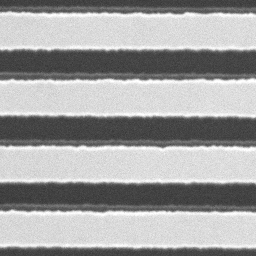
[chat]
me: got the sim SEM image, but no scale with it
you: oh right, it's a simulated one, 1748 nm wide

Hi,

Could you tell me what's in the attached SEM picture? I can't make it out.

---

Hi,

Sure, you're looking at lines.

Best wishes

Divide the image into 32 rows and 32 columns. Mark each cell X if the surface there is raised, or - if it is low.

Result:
--------------------------------
--------------------------------
XXXXXXXXXXXXXXXXXXXXXXXXXXXXXXXX
XXXXXXXXXXXXXXXXXXXXXXXXXXXXXXXX
XXXXXXXXXXXXXXXXXXXXXXXXXXXXXXXX
XXXXXXXXXXXXXXXXXXXXXXXXXXXXXXXX
--------------------------------
--------------------------------
--------------------------------
--------------------------------
XXXXXXXXXXXXXXXXXXXXXXXXXXXXXXXX
XXXXXXXXXXXXXXXXXXXXXXXXXXXXXXXX
XXXXXXXXXXXXXXXXXXXXXXXXXXXXXXXX
XXXXXXXXXXXXXXXXXXXXXXXXXXXXXXXX
------------XX--XXX-X--X-XXXXXXX
--------------------------------
--------------------------------
--------------------------------
XXXXXXXXXXXXXXXXXXXXXXXXXXXXXXXX
XXXXXXXXXXXXXXXXXXXXXXXXXXXXXXXX
XXXXXXXXXXXXXXXXXXXXXXXXXXXXXXXX
XXXXXXXXXXXXXXXXXXXXXXXXXXXXXXXX
XXXXXXXXXXXXXXXXXXXXXXXXXXXXXXXX
--------------------------------
--------------------------------
--------------------------------
XXXXXXXXXXXX-XXXXXXXXXXX--X--XX-
XXXXXXXXXXXXXXXXXXXXXXXXXXXXXXXX
XXXXXXXXXXXXXXXXXXXXXXXXXXXXXXXX
XXXXXXXXXXXXXXXXXXXXXXXXXXXXXXXX
XXXXXXXXXXXXXXXXXXXXXXXXXXXXXXXX
--------------------------------